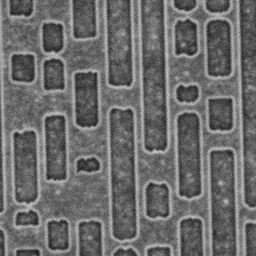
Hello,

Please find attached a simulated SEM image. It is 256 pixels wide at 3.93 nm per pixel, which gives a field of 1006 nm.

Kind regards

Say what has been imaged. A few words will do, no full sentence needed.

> parallel lines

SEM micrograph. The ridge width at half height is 34.4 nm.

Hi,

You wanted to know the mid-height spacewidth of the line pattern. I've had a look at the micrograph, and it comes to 95.3 nm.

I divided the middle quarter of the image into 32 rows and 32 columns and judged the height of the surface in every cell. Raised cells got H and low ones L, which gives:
HHHHHHHHHHHLLLLLLHHLLLLLLLHHHHHH
HHHHHHHHHHHLLLLLLHHLLLLLLLHHHHHH
HHHLLLLLHHHLLLLLLHHLLLLLLLHHHHHH
HHLLLLLLHHHLLLLLLHHLLLLLLLHHHHHH
HHLLLLLLHHHLLLLLLHHLLLLLLLHHHHHH
HHLLLLLLLHHHLLLLLHHLLLLLLLHHHLHL
HHLLLLLLLHHHHHHHHHHHLLLLLLHHLLLL
HHLLLLLLLHHHHHHHHHHHLLLLLLHHLLLL
HHHLLLLLLHHHHHHHHHHHLLLLLLHHLLLL
HHHLLLLLLHHHHHHHHHHHLLLLLLHHHLLL
HHHLLLLLLHHHHHHHHHHHLLLLLLHHHHHH
HHHLLLLLLHHHLLLLLHHHLLLLLLHHHHHH
HHHLLLLLLHHLLLLLLLHHLLLLLLHHHLLL
HHHLLLLLLHHLLLLLLLHHLLLLLLHHLLLL
HHHLLLLLLHHLLLLLLLHHLLLLLLHHLLLL
LHHHLLLLHHHLLLLLLLHHLLLLLLHHLLLL
LHHHHHHHHHHLLLLLLLHHLLLLLLHHLLLL
LHHHHHHHHHHLLLLLLLHHLLLLLLHHLLLL
LHHHHHHHHHHLLLLLLLHHLLLLLLHHLLLL
LHHHHHHHHHHLLLLLLLHHLLLLLLHHLLLL
LHHHHHHHHHHLLLLLLLHHLLLLLLHHLLLL
LHHHHHHHHHHLLLLLLLHHLLLLLHHHLLLL
LHHHHHHHHHHLLLLLLLHHHHHHHHHHLLLL
LHHHLHLLHHHLLLLLLLHHHHHHHHHHLLLL
LHHLLLLLLHHLLLLLLLHHHHHHHHHHLLLL
LHHLLLLLLHHLLLLLLLHHHHHHHHHHLLLL
LHHLLLLLLHHHLLLLLLHHHHHHHHHHLLLL
LHHHHHHHHHHHLLLLLLHHHHHHHHHHLLLL
LHHHHHHHHHHHLLLLLLHHHHHHHHHHLLLL
HHHHHHHHHHHHLLLLLLHHHHHHHHHHLLLL
HHHHHHHHHHHHLLLLLLHHHLLLLLHHLLLL
HHHHHHHHHHHHLLLLLLHHLLLLLLHHLLLL